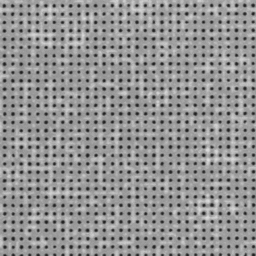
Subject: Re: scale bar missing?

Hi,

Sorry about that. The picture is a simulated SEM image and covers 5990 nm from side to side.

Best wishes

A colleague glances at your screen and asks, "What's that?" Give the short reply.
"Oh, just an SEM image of a regular array of holes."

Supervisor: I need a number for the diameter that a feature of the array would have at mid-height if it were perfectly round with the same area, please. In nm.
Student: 91.5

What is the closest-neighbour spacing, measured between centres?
181 nanometers